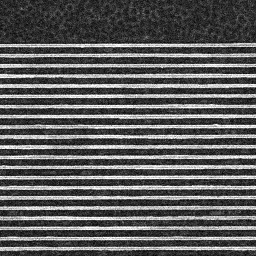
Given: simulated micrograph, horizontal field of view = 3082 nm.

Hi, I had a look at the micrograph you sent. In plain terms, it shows parallel lines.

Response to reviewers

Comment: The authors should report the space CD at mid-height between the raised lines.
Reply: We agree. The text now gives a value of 94.8 nm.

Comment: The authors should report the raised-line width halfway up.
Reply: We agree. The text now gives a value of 31.6 nanometers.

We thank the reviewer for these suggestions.